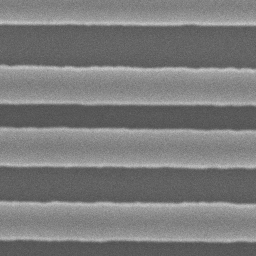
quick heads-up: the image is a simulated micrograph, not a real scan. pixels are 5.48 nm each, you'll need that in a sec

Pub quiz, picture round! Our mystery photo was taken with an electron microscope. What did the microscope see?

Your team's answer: lines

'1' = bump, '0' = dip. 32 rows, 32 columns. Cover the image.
11111111111111111111111111111111
11111111111111111111111111111111
11111111111111111111111111111111
00000000000000000000000000000000
00000000000000000000000000000000
00000000000000000000000000000000
00000000000000000000000000000000
00000000000000000000000000000000
11111111111111111000111000001000
11111111111111111111111111111111
11111111111111111111111111111111
11111111111111111111111111111111
11111111111111111111111111111111
00000000000000000000000000000000
00000000000000000000000000000000
00000000000000000000000000000000
11111111111111111111111111111111
11111111111111111111111111111111
11111111111111111111111111111111
11111111111111111111111111111111
11111111111111111111111111111111
00000000000000000000000000000000
00000000000000000000000000000000
00000000000000000000000000000000
00000000000000000000000000000000
11111111111111111111111111111000
11111111111111111111111111111111
11111111111111111111111111111111
11111111111111111111111111111111
11111111111111111111111111111111
00000000000000000000000000000000
00000000000000000000000000000000